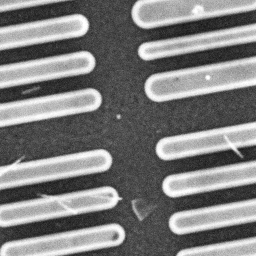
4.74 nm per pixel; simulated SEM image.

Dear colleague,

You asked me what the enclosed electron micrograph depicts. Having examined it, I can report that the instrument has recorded groups of lines, slits or small figures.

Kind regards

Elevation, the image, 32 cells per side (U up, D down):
UUUUUDDDDDDDDDDDDUUUUUUUUUUUUUUU
DDDDDDDDDDDDDDDDDUUUUUUUUUUUUDDD
DDDDDDDUUUUDDDDDDUUUUUUUDDDDDDDD
DUUUUUUUUUUDDDDDDDDDDDDDDDDDDDUU
UUUUUUUUUDDDDDDDDDDDDDDDDUUUUUUU
UUUDDDDDDDDDDDDDDDDUUUUUUUUUUDDD
DDDDDDDDDDDDDDDDDDUUUUUDDDDDDDDD
DDDDDDUUUUUUDDDDDDDDDDDDDDDDDDDU
UUUUUUUUUUUDDDDDDDDDDDDDDUUUUUUU
UUUUUUUUDDDDDDDDDDDDUUUUUUUUUUUU
UUDDDDDDDDDDDDDDDDUUUUUUUUUUUUUD
DDDDDDDDDDUUDDDDDDUUUUUUUUDDDDDD
DDDDUUUUUUUUDDDDDDDDDDDDDDDDDDDD
UUUUUUUUUUUUDDDDDDDDDDDDDDDDDDDD
UUUUUUUDDDDDDDDDDDDDDDDDDDDDDDDD
UDDDDDDDDDDDDDDDDDDDDDDDDDDDDDDD
DDDDDDDDDDDDDDDDDDDDDDDDDDUUUUUU
DDDDDDDDDDDDDDDDDDDDDUUUUUUUUUUU
DDDDDDDDDDDDDDDDDDDDUUUUUUUUUUDD
DDDDDDDDDUUUUUDDDDDDUUUDDDDDDDDD
DDDDUUUUUUUUUUDDDDDDDDDDDDDDDDDU
UUUUUUUUUUUDDDDDDDDDDDDDDUUUUUUU
UUUUUUDDDDDDDDDDDDDDDUUUUUUUUUUU
DDDDDDDDDDDDDDDDDDDDDUUUUUUDDDDD
DDDDDDDDUUUUUUUDDDDDDDDDDDDDDDDD
DDUUUUUUUUUUUUDDDDDDDDDDDDDDDDUU
UUUUUUUUUUDDDDDDDDDDDDDDUUUUUUUU
UUUUUDDDDDDDDDDDDDDDDDUUUUUUUUUU
DDDDDDDDDDDDUUUDDDDDDDUUUUDDDDDD
DDDDDDDUUUUUUUUDDDDDDDDDDDDDDDDD
DUUUUUUUUUUUUUUDDDDDDDDDDDDDUUUU
UUUUUUUUUDDDDDDDDDDDDDDUUUUUUUUU